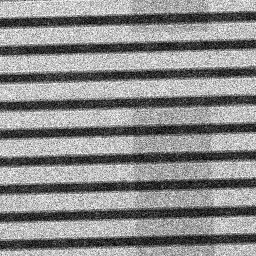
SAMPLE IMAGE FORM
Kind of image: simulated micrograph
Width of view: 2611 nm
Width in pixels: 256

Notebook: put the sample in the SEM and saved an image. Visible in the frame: parallel lines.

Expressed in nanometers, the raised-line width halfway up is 164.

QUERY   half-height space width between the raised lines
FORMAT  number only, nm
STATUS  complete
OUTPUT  121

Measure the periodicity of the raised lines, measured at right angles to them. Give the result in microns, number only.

0.283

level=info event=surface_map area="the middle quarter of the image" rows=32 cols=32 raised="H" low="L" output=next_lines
HHHHHHHHHHHHHHHHHHHHHHHHHHHHHHHH
HHHHHHLLLLLLLLLLLLLLLLLLLLLLLLLL
LLLLLLLLLLLLLLLLLLLLLLLLLLLLLLLL
LLLLLLLLLLLLLLLLLLLLLLLLLLLLLLLL
LLLLLLLLLLLLLLHHHHHHHHHHHHHHHHHH
HHHHHHHHHHHHHHHHHHHHHHHHHHHHHHHH
HHHHHHHHHHHHHHHHHHHHHHHHHHHHHHHH
HHHHHHHHHHHHHHHHHHHHHHHHHHHHHHHH
HHHHHHLLLLLLLLLLLLLLLLLLLLLLLLLL
LLLLLLLLLLLLLLLLLLLLLLLLLLLLLLLL
LLLLLLLLLLLLLLLLLLLLLLLLLLLLLLLL
LLLLLLLLLLLLLLHHHHHHHHHHHHHHHHHH
HHHHHHHHHHHHHHHHHHHHHHHHHHHHHHHH
HHHHHHHHHHHHHHHHHHHHHHHHHHHHHHHH
HHHHHHHHHHHHHHHHHHHHHHHHHHHHHHHH
HHHHHHHLLLLLLLLLLLLLLLLLLLLLLLLL
LLLLLLLLLLLLLLLLLLLLLLLLLLLLLLLL
LLLLLLLLLLLLLLLLLLLLLLLLLLLLLLLL
LLLLLLLHHHHHHHHHHHHHHHHHHHHHHHHH
HHHHHHHHHHHHHHHHHHHHHHHHHHHHHHHH
HHHHHHHHHHHHHHHHHHHHHHHHHHHHHHHH
HHHHHHHHHHHHHHHHHHHHHHHHHHHHHHHH
HLLLLHLLLLLLLLLLLLLLLLLLLLLLLLLL
LLLLLLLLLLLLLLLLLLLLLLLLLLLLLLLL
LLLLLLLLLLLLLLLLLLLLLLLLLLLLLLLL
LLLLLLLLHHHHHHHHHHHHHHHHHHHHHHHH
HHHHHHHHHHHHHHHHHHHHHHHHHHHHHHHH
HHHHHHHHHHHHHHHHHHHHHHHHHHHHHHHH
HHHHHHHHHHHHHHHHHHHHHHHHHHHHHHHH
HLLLLLLLLLLLLLLLLLLLLLLLLLLLLLLL
LLLLLLLLLLLLLLLLLLLLLLLLLLLLLLLL
LLLLLLLLLLLLLLLLLLLLLLLLLLLLLLLL